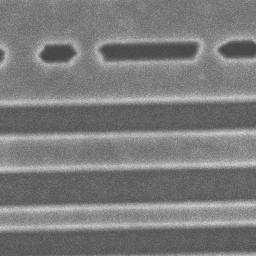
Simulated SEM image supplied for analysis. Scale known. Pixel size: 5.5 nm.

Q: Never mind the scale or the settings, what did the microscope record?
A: one or a few lines or trenches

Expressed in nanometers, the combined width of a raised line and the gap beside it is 368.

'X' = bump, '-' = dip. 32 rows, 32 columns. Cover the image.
XXXXXXXXXXXXXXXXXXXXXXXXXXXXXXXX
XXXXXXXXXXXXXXXXXXXXXXXXXXXXXXXX
XXXXXXXXXXXXXXXXXXXXXXXXXXXXXXXX
XXXXXXXXXXXXXXXXXXXXXXXXXXXXXXXX
XXXXXXXXXXXXXXXXXXXXXXXXXXXXXXXX
XXXXXXXXXXXXXX-X--------XXXX----
XXXXX----XXXX------------XX-----
XXXXX----XXXX-------XXXXXXXXXXXX
XXXXXXXXXXXXXXXXXXXXXXXXXXXXXXXX
XXXXXXXXXXXXXXXXXXXXXXXXXXXXXXXX
XXXXXXXXXXXXXXXXXXXXXXXXXXXXXXXX
XXXXXXXXXXXXXXXXXXXXXXXXXXXXXXXX
XXXXXXXXXXXXXXXXXXXXXXXXXXXXXX--
--------------------------------
--------------------------------
--------------------------------
--------------------------XXXXXX
XXXXXXXXXXXXXXXXXXXXXXXXXXXXXXXX
XXXXXXXXXXXXXXXXXXXXXXXXXXXXXXXX
XXXXXXXXXXXXXXXXXXXXXXXXXXXXXXXX
XXXXXXXXXXXXXXXXXXXXXXXXXXXXXXXX
--------------------------------
--------------------------------
--------------------------------
--------------------------------
-----------------------X--XXXXXX
XXXXXXXXXXXXXXXXXXXXXXXXXXXXXXXX
XXXXXXXXXXXXXXXXXXXXXXXXXXXXXXXX
XXXXXXXXXX----------------------
--------------------------------
--------------------------------
--------------------------------